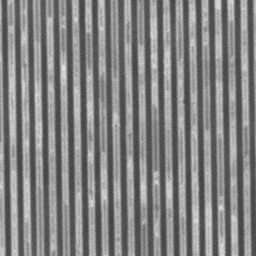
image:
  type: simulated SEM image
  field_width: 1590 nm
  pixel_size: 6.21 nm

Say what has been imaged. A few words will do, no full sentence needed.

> parallel lines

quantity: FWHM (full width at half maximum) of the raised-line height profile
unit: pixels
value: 5.49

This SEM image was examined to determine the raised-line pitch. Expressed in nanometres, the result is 80.3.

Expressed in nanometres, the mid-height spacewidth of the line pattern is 46.5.